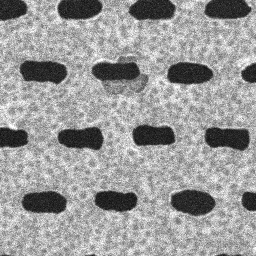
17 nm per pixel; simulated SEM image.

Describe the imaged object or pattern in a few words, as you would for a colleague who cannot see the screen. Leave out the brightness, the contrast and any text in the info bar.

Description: a regular array of holes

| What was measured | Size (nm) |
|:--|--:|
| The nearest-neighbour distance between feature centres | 1220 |